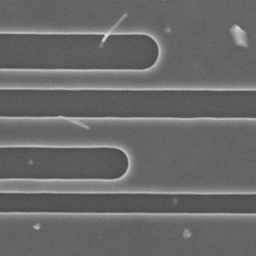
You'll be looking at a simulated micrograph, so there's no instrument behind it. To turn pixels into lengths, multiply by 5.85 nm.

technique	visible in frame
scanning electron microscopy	groups of lines, slits or small figures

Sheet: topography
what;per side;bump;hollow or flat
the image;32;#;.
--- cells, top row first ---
################################
################################
################################
################################
...................#############
....................############
....................############
....................############
...................#############
################################
################################
................................
................................
................................
................................
################################
################################
################################
...............#################
................################
................################
................################
#############.##################
################################
................................
................................
................................
################################
################################
################################
################################
################################